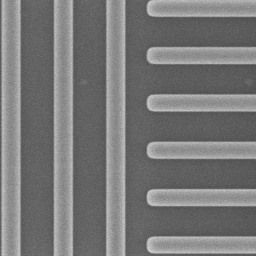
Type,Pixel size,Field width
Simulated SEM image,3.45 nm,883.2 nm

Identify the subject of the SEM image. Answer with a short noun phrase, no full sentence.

groups of lines, slits or small figures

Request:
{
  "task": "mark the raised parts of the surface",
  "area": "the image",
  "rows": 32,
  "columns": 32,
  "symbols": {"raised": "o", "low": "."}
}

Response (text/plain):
oo.....oo....ooo..oooooooooooooo
oo.....oo....ooo..oooooooooooooo
oo.....oo....ooo................
oo.....oo....ooo................
oo.....oo....ooo................
oo.....oo....ooo................
oo.....oo....ooo..oooooooooooooo
oo.....oo....ooo...ooooooooooooo
oo.....oo....ooo................
oo.....oo....ooo................
oo.....oo....ooo................
oo.....oo....ooo................
oo.....oo....ooo..oooooooooooooo
oo.....oo....ooo...ooooooooooooo
oo.....oo....ooo................
oo.....oo....ooo................
oo.....oo....ooo................
oo.....oo....ooo................
oo.....oo....ooo..oooooooooooooo
oo.....oo....ooo...ooooooooooooo
oo.....oo....ooo................
oo.....oo....ooo................
oo.....oo....ooo................
oo.....oo....ooo................
oo.....oo....ooo..oooooooooooooo
oo.....oo....ooo...ooooooooooooo
oo.....oo....ooo................
oo.....oo....ooo................
oo.....oo....ooo................
oo.....oo....ooo................
oo.....oo....ooo..oooooooooooooo
oo.....oo....ooo...ooooooooooooo